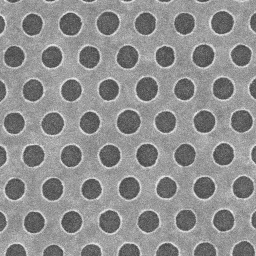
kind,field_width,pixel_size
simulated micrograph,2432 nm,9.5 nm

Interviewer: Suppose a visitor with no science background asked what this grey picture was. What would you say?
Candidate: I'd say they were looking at a regular array of holes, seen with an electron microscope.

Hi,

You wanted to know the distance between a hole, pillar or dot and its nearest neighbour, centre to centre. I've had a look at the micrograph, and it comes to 355 nm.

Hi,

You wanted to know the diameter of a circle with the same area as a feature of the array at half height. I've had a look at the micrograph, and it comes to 22.2 pixels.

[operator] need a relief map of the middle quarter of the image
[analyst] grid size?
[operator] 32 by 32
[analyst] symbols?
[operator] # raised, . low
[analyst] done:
#####...######....######...#####
################################
################################
###################...##########
...#######...#####.....#####....
....#####.....####.....#####....
....#####.....####......###.....
....#####.....####.....#####....
....#####....######....#####....
####################.###########
################################
################.###############
#####...######.....####....#####
####.....####......####.....####
####.....####......####.....####
####.....####......####.....####
####....######....######...#####
######.########..###############
################################
################################
#..#######...######....######...
....#####.....####.....#####....
.....####.....####......####....
....#####.....####.....#####....
....#####.....####.....#####....
...#######...######...#######..#
################################
################################
###############...#######..#####
#####....#####.....#####....####
####.....#####.....####.....####
####......####.....####.....####